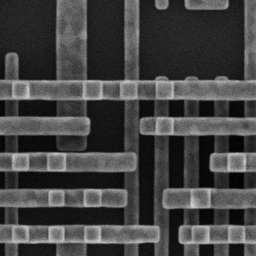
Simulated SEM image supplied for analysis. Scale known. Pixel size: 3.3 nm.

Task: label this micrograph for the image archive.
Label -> wiring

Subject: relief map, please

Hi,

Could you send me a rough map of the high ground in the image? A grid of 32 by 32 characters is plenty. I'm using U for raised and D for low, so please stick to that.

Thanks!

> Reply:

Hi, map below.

DDDDDDDDDDDDDDDDDDDDDDDDDDDDDDDD
DDDDDDDDDDDDDDDDDDDDDDDDDDDDDDDD
DDDDDDDDDDDDDDDDDDDDDDDDDDDDDDDD
DDDDDDDDDDDDDDDDDDDDDDDDDDDDDDDD
DDDDDDDDDDDDDDDDDDDDDDDDDDDDDDDD
DDDDDDDDDDDDDDDDDDDDDDDDDDDDDDDD
DDDDDDDDDDDDDDDDDDDDDDDDDDDDDDDD
DDDDDDDDDDDDDDDDDDDDDDDDDDDDDDDD
DDDDDDDDDDDDDDDDDDDDDDDDDDDDDDDD
DDDDDDDDDDDDDDDDDDDDDDDDDDDDDDDD
UUUUUUUUUUUUUUUUUUUUUUUUUUUUUUUU
UUUUUUUUUUUUUUUUUUUUUUUUUUUUUUUU
DDDDDDDDDDDDDDDDDDDDDDDDDDDDUUDD
DDDDDDDDDDDDDDDDDDDDDDDDDDDDDDDD
DDDDDDDDDDDDDDDDDDDDDDDDDDDDDDDD
UUUUUUUUUUUDDDDDDUUUUUUUUUUUUUUU
UUUUUUUUUUUDDDDDDDUUUUUUUUUUUUUU
DDDDDDDDDDDDDDDDDDDDDDDDDDDDDDDD
DDDDDDDDDDDDDDDDDDDDDDDDDDDDDDDD
UUUUUUUUUUUUUUUUUDDDDDDDDDUUUUUU
UUUUUUUUUUUUUUUUUDDDDDDDDDUUUUUU
DDDDDDDDDDDDDDDDDDDDDDDDDDDDUUUD
DDDDDDDDDDDDDDDDDDDDDDDDDDDDDDDD
DDDDDDDDDDDDDDDDDDDDDDDDDDDDDDDD
UUUUUUUUUUUUUUUUDDDDUUUUUUUUUUUU
UUUUUUUUUUUUUUUUDDDDUUUUUUUUUUUU
DDDDDDDDDDDDDDDDDDDDDDDDDDDDDDDD
DDDDDDDDDDDDDDDDDDDDDDDDDDDDDDDD
UUUUUUUUUUUUUUUUUUUUDDDUUUUUUUUU
UUUUUUUUUUUUUUUUUUUUDDUUUUUUUUUU
DDDDDDDDDDDDDDDDDDDDDDDUUUDDDDDD
DDDDDDDDDDDDDDDDDDDDDDDDDDDDDDDD